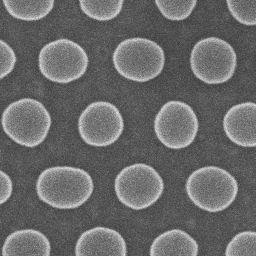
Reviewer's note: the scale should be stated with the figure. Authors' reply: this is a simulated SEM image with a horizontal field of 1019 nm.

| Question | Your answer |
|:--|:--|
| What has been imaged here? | a regular array of raised bodies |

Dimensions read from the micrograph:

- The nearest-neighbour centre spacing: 72.3 pixels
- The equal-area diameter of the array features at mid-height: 182 nm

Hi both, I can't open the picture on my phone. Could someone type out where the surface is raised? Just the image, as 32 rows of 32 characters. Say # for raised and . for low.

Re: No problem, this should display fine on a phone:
.######...#####.....####.....###
.#####.....####.....####.....###
...#..........................##
................................
................................
#.....###......#####.....####...
##...######...######....#####...
##...######...######....#####...
##...######....#####....#####...
......####.....####......####...
................................
................................
...#............................
.#####.....###......####.....###
######....#####.....####....####
######....#####....######...####
.#####....#####.....#####...####
..###......###......####.....###
......................#.........
................................
................................
.....######....####.....####....
#....######....#####....#####...
#....#######..######...#######..
#....######....#####....#####...
......####......###......####...
................................
................................
............#...................
.####.....#####.....####......##
.#####....######...######....###
######...#######...######...####